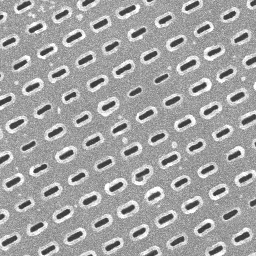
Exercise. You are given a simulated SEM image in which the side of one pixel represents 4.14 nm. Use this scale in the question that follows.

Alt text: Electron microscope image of a regular array of holes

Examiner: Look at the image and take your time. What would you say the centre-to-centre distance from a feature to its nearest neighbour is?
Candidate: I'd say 105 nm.